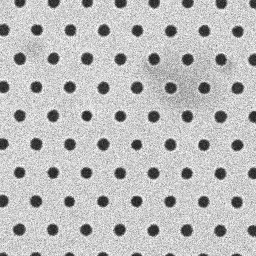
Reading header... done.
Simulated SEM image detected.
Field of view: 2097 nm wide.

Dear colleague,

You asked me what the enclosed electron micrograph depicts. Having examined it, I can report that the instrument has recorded a regular array of holes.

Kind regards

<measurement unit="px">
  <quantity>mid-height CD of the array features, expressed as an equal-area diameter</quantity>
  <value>12.5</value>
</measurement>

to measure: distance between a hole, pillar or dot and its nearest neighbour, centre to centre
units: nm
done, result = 269